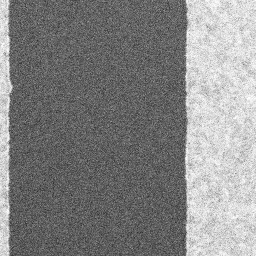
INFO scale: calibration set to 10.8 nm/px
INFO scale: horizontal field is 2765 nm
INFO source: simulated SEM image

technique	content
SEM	one or a few lines or trenches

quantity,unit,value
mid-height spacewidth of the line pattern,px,179